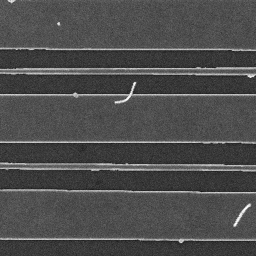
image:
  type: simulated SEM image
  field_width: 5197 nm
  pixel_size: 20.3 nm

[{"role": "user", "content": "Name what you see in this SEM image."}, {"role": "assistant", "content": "lines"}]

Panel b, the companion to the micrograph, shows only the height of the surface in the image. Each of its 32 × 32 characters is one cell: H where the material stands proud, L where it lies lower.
HHHHHHHHHHHHHHHHHHHHHHHHHHHHHHHH
HHHHHHHHHHHHHHHHHHHHHHHHHHHHHHHH
HHHHHHHHHHHHHHHHHHHHHHHHHHHHHHHH
HHHHHHHHHHHHHHHHHHHHHHHHHHHHHHHH
HHHHHHHHHHHHHHHHHHHHHHHHHHHHHHHH
HHHHHHHHHHHHHHHHHHHHHHHHHHHHHHHH
LLLLLLLLLLLLLLLLLLLLLLLLLLLLLLLL
LLLLLLLLLLLLLLLLLLLLLLLLLLLLLLLL
LLLLLLLLLLLLLLLLLLLLLLLLLLLLLHLH
LLLLLLLLLLLLLLLLLLLLLLLLLLLLLLLL
LLLLLLLLLLLLLLLLLLLLLLLLLLLLLLLL
LLLLLLLLLLLLLLLLLLLLLLLLLLLLLLLL
HHHHHHHHHHHHHHHHHHHHHHHHHHHHHHHH
HHHHHHHHHHHHHHHHHHHHHHHHHHHHHHHH
HHHHHHHHHHHHHHHHHHHHHHHHHHHHHHHH
HHHHHHHHHHHHHHHHHHHHHHHHHHHHHHHH
HHHHHHHHHHHHHHHHHHHHHHHHHHHHHHHH
HHHHHHHHHHHHHHHHHHHHHHHHHHHHHHHH
LLLLLLLLLLLLLLLLLLLLLLLLLLLLLLLL
LLLLLLLLLLLLLLLLLLLLLLLLLLLLLLLL
HLLLLLLLLLLLLLLLLLLLLLLLLLLLLLLL
LLLLLLLLLLLLLLLLLLLLLLLLLLLLLLLL
LLLLLLLLLLLLLLLLLLLLLLLLLLLLLLLL
LLLLLLLLLLLLLLLLLLLLLLLLLLLLLLLL
HHHHHHHHHHHHHHHHHHHHHHHHHHHHHHHH
HHHHHHHHHHHHHHHHHHHHHHHHHHHHHHHH
HHHHHHHHHHHHHHHHHHHHHHHHHHHHHHHH
HHHHHHHHHHHHHHHHHHHHHHHHHHHHHHHH
HHHHHHHHHHHHHHHHHHHHHHHHHHHHHHHH
HHHHHHHHHHHHHHHHHHHHHHHHHHHHHHHH
LLLLLLLLLLLLLLLLLLLLLLLLLLLLLLLL
LLLLLLLLLLLLLLLLLLLLLLLLLLLLLLLL